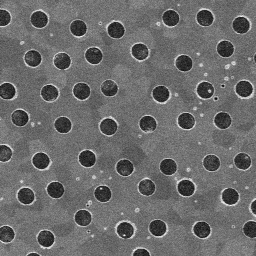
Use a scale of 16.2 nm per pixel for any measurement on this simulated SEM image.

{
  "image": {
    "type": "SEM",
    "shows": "a regular array of holes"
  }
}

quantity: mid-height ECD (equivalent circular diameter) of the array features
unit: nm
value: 278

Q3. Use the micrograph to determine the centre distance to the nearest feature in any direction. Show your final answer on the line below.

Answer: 520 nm